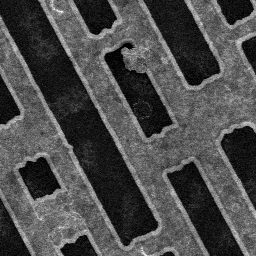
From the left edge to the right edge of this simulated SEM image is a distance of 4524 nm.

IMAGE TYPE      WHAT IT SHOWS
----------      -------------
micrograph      one or a few lines or trenches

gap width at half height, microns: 0.709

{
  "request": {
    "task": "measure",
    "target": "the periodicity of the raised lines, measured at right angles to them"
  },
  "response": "1120 nm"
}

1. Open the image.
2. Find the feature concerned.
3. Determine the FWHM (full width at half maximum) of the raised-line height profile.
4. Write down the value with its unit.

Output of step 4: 451 nm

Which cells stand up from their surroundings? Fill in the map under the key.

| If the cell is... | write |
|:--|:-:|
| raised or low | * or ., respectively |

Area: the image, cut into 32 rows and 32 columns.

.....****.....****......***.....
......****.....***......***.....
......****.....****......***...*
.......****...*****......*******
*.......***..*******......*****.
**......*******..***......****..
**.......****..******......***..
***......****..*******.....****.
***.......***...******......***.
.***......****.....****....*****
.***.......***.....****..*******
..***......****.....************
..***.......***.....************
...***......****.....***********
...***.......***......**********
.******......****.....**********
*******.......****..********....
********.......***.********.....
*********......************.....
*****.***.......************....
***...***.......*******..***....
**.....***.......****....****...
**.....****......****.....****..
***.....***.......***.....****..
***....*****......****.....****.
.***********.......***.....****.
.************......****.....****
..***********.......***......***
..************......****.....***
...*******.***....*******.....**
....****....***..********.....**
....***.....********..****.....*